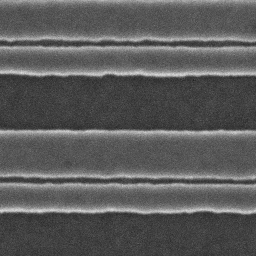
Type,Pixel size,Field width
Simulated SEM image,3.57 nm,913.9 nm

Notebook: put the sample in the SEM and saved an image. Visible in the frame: lines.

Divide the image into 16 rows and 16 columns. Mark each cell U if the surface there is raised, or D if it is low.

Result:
UUUUUUUUUUUUUUUU
UUUUUUUUUUUUUUUU
UUUUUUUUUUUUUUUU
UUUUUUUUUUUUUUUU
UUUUUUUUUUUUUUUU
DDDDDDDDDDDDDDDD
DDDDDDDDDDDDDDDD
DDDDDDDDDDDDDDDD
UUUUUUUUUUUUUUUU
UUUUUUUUUUUUUUUU
UUUUUUUUUUUUUUUU
UUUUUUUUUUUUUUUU
UUUUUUUUUUUUUUUU
DDDDDDDDDDDDDDDD
DDDDDDDDDDDDDDDD
DDDDDDDDDDDDDDDD